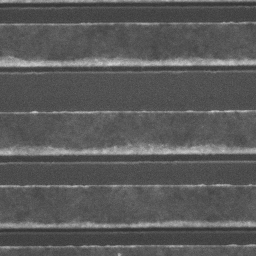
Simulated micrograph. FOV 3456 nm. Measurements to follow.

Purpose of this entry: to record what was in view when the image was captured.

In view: lines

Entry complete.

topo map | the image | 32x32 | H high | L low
LLLLLLLLLLLLLLLLLLLLLLLLLLLLLLLL
LLLLLLLLLLLLLLLLLLLLLLLLLLLLLLLL
LLLLLLLLLLLLLLLLLLLLLLLLLLLLLLLL
HHHHHHHHHHHHHHHHHHHHHHHHHHHHHHHH
HHHHHHHHHHHHHHHHHHHHHHHHHHHHHHHH
HHHHHHHHHHHHHHHHHHHHHHHHHHHHHHHH
HHHHHHHHHHHHHHHHHHHHHHHHHHHHHHHH
HHHHHHHHHHHHHHHHHHHHHHHHHHHHHHHH
LLLLLLLLLLLLLLLLLLLLLLLLLLLLLLLL
LLLLLLLLLLLLLLLLLLLLLLLLLLLLLLLL
LLLLLLLLLLLLLLLLLLLLLLLLLLLLLLLL
LLLLLLLLLLLLLLLLLLLLLLLLLLLLLLLL
LLLLLLLLLLLLLLLLLLLLLLLLLLLLLLLL
LLLLLLLLLLLLLLLLLLLLLLLLLLLLLLLL
HHHHHHHHHHHHHHHHHHHHHHHHHHHHHHHH
HHHHHHHHHHHHHHHHHHHHHHHHHHHHHHHH
HHHHHHHHHHHHHHHHHHHHHHHHHHHHHHHH
HHHHHHHHHHHHHHHHHHHHHHHHHHHHHHHH
HHHHHHHHHHHHHHHHHHHHHHHHHHHHHHHH
LLLLLLLLLLLLLLLLLLLLLLLLLLLLLLLL
LLLLLLLLLLLLLLLLLLLLLLLLLLLLLLLL
LLLLLLLLLLLLLLLLLLLLLLLLLLLLLLLL
LLLLLLLLLLLLLLLLLLLLLLLLLLLLLLLL
HHHHHHHHHHHHHHHHHHHHHHHHHHHHHHHH
HHHHHHHHHHHHHHHHHHHHHHHHHHHHHHHH
HHHHHHHHHHHHHHHHHHHHHHHHHHHHHHHH
HHHHHHHHHHHHHHHHHHHHHHHHHHHHHHHH
HHHHHHHHHHHHHHHHHHHHHHHHHHHHHHHH
LLLLLLLLLLLLLLLLLLLLLLLLLLLLLLLL
LLLLLLLLLLLLLLLLLLLLLLLLLLLLLLLL
LLLLLLLLLLLLLLLLLLLLLLLLLLLLLLLL
HHHHHHHHHHHHHHHHHHHHHHHHHHHHHHHH